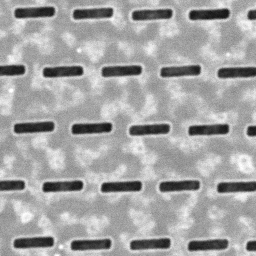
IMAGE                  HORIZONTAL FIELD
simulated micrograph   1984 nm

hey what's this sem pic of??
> a regular array of holes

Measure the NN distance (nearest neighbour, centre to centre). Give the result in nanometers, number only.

450